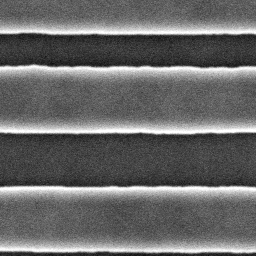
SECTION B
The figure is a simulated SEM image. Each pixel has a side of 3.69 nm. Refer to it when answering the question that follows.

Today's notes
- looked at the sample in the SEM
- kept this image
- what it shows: lines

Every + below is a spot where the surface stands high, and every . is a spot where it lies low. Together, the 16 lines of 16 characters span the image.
++++++++++++++++
++++++++++++++++
................
................
++++++++++++++++
++++++++++++++++
++++++++++++++++
++++++++++++++++
................
................
................
................
++++++++++++++++
++++++++++++++++
++++++++++++++++
++++++++++++++++